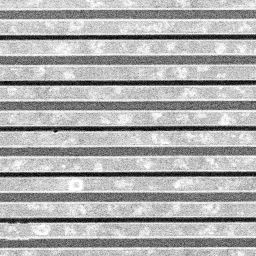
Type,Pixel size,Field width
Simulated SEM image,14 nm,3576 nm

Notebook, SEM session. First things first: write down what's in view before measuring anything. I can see parallel lines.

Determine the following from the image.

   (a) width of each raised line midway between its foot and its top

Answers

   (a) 206 nm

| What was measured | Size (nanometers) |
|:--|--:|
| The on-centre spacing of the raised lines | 315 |